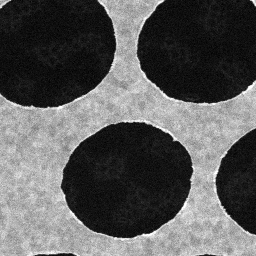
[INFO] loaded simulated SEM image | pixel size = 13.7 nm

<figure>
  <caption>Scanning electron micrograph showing holes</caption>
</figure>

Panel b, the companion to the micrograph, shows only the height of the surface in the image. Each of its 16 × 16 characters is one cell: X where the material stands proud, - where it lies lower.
-------XXX------
-------XX-------
-------XX-------
-------XX-------
-------XX-------
------XXXX-----X
X---XXXXXXXXXXXX
XXXXXXXXXXXXXXXX
XXXXXX-----XXXX-
XXXXX-------XX--
XXXX--------XX--
XXXX--------X---
XXXX--------XX--
XXXXX------XXX--
XXXXXX----XXXXXX
XXXXXXXXXXXXXXXX